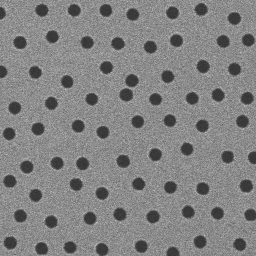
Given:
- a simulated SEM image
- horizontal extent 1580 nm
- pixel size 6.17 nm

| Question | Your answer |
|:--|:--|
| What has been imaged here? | a regular array of holes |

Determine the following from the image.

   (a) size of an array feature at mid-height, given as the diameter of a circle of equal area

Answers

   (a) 81.2 nanometers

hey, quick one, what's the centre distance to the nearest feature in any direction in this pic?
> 27.1 px